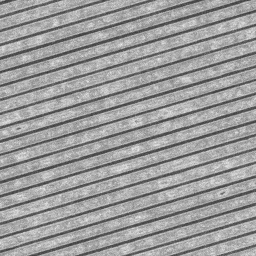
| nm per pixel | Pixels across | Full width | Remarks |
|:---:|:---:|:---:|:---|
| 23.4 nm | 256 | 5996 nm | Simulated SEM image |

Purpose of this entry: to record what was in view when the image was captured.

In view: parallel lines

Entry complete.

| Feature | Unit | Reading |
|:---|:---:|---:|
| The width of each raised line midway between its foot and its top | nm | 225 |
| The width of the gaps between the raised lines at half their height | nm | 89.8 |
